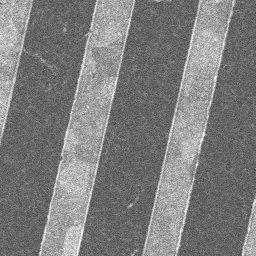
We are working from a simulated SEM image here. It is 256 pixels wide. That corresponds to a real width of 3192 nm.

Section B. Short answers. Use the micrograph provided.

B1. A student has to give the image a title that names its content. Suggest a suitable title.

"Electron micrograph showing one or a few lines or trenches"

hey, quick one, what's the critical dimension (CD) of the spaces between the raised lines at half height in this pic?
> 0.798 um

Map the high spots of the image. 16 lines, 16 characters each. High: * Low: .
**....**....***.
**....**....**..
*....***....**..
*....***....**..
*....**.....**..
*....**....**...
*....**....**...
....***....**...
....***....**...
....**....**....
....**....**....
...***....**....
...***....**....
...**.....**....
...**....**.....
...**....**....*